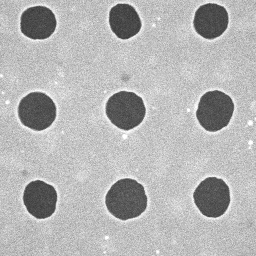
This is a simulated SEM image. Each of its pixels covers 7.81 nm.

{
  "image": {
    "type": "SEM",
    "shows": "a regular array of holes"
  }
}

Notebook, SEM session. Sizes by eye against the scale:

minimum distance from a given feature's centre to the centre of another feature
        674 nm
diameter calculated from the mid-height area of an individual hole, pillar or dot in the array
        297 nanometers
